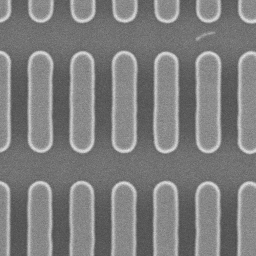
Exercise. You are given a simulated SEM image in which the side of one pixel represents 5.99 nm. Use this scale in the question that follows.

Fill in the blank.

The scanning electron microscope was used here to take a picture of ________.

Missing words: groups of lines, slits or small figures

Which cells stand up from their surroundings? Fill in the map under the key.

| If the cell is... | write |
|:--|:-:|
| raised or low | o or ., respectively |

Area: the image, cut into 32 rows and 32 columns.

o...ooo..ooo..ooo..ooo...ooo..oo
o...oo...ooo..ooo..ooo...ooo..oo
o...oo....o....o....oo...oo....o
................................
................................
................................
................................
o...oo...ooo..ooo..ooo...oo...oo
o...oo...ooo..ooo..ooo...ooo..oo
o...oo...ooo..ooo..ooo...ooo..oo
o...oo...ooo..ooo..ooo...ooo..oo
o...oo...ooo..ooo..ooo...oo...oo
o...oo...ooo..ooo..ooo...oo...oo
o...oo...ooo..ooo..ooo...ooo..oo
o...oo...ooo..ooo..ooo...oo...oo
o...oo...ooo..ooo..ooo...ooo..oo
o...oo...ooo..ooo..ooo...ooo..oo
o...oo...ooo..ooo..ooo...ooo..oo
o...oo...oo...ooo...oo...oo...oo
................................
................................
................................
................................
o...oo...oo...ooo..ooo...oo...oo
o...oo...ooo..ooo..ooo...oo...oo
o...oo...ooo..ooo..ooo...oo...oo
o...oo...ooo..ooo..ooo...oo...oo
o...oo...ooo..ooo..ooo...oo...oo
o...oo...ooo..ooo..ooo...oo...oo
o...oo...ooo..ooo..ooo...oo...oo
o...oo...ooo..ooo..ooo...oo...oo
o...oo...ooo..ooo..ooo...oo...oo